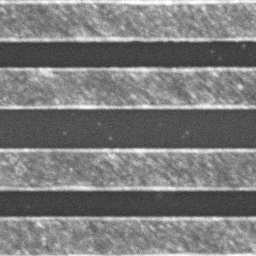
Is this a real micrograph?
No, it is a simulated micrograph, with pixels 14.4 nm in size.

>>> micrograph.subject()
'lines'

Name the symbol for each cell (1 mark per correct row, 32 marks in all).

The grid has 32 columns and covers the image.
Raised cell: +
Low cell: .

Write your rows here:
++++++++++++++++++++++++++++++++
++++++++++++++++++++++++++++++++
++++++++++++++++++++++++++++++++
++++++++++++++++++++++++++++++++
++++++++++++++++++++++++++++++++
................................
................................
................................
................................
++++++++++++++++++++++++++++++++
++++++++++++++++++++++++++++++++
++++++++++++++++++++++++++++++++
++++++++++++++++++++++++++++++++
+...............................
................................
................................
................................
................................
................................
++++++++++++++++++++++++++++++++
++++++++++++++++++++++++++++++++
++++++++++++++++++++++++++++++++
++++++++++++++++++++++++++++++++
++++++++++++++++++++++++++++++++
................................
................................
................................
++++++++++++++++++++++++++++++++
++++++++++++++++++++++++++++++++
++++++++++++++++++++++++++++++++
++++++++++++++++++++++++++++++++
++++++++++++++++++++++++++++++++